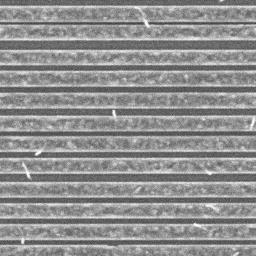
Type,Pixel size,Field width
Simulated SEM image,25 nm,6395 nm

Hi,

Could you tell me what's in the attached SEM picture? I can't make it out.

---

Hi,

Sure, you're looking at parallel lines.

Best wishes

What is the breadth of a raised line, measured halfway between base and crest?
375 nanometres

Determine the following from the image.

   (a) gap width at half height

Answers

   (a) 156 nanometers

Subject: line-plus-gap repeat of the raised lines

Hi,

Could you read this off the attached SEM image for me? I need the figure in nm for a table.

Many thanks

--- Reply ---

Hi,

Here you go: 545